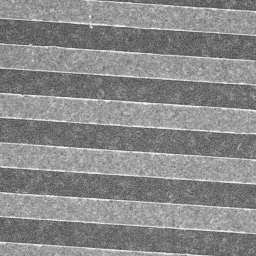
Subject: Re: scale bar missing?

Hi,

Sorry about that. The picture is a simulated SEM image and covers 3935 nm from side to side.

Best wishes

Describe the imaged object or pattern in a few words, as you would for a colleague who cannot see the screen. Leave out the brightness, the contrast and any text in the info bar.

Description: parallel lines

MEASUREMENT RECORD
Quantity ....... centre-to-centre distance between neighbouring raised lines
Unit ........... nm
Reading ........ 760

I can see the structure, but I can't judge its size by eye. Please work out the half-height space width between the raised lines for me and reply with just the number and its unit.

0.385 um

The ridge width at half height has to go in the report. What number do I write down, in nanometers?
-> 370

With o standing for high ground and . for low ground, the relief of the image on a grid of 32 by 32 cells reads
oooooooooooooooooo..............
oooooooooooooooooooooooooooooooo
...ooooooooooooooooooooooooooooo
..................oooooooooooooo
................................
................................
ooooooooooooooo.................
oooooooooooooooooooooooooooooo..
oooooooooooooooooooooooooooooooo
...............ooooooooooooooooo
...............................o
................................
ooooooooooooo...................
oooooooooooooooooooooooooooo....
oooooooooooooooooooooooooooooooo
.............ooooooooooooooooooo
............................oooo
................................
ooooooooo.......................
ooooooooooooooooooooooooo.......
oooooooooooooooooooooooooooooooo
..........oooooooooooooooooooooo
.........................ooooooo
................................
ooooooo.........................
oooooooooooooooooooooo..........
oooooooooooooooooooooooooooooooo
.......ooooooooooooooooooooooooo
......................oooooooooo
................................
ooo.............................
oooooooooooooooooo..............